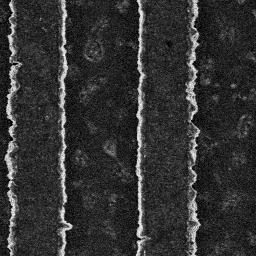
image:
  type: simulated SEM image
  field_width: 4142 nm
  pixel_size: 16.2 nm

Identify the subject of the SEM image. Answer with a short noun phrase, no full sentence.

one or a few lines or trenches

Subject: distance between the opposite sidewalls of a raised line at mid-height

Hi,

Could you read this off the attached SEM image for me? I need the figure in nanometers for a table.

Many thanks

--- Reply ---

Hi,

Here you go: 874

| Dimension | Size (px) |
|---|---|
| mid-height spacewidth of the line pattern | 76.3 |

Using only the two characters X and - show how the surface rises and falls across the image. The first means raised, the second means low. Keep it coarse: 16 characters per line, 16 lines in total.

-XXX-----XXX----
-XXX-----XXX----
-XXX-----XXX----
-XXX-----XXX----
-XXX-----XXX----
-XXX-----XXX----
-XXX-----XXX----
-XXX-----XXX----
-XXX-----XXX----
-XXX-----XXX----
-XXX-----XXX----
-XXX-----XXX----
-XXX-----XXX----
-XXX-----XXX----
-XXX-----XXX----
-XXX-----XXX----